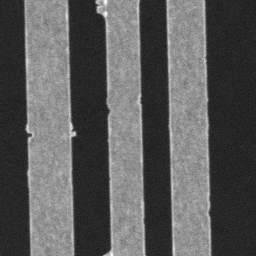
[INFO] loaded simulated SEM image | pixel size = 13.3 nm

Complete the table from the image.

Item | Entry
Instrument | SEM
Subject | one or a few lines or trenches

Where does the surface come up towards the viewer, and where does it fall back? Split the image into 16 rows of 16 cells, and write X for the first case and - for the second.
--XX--XXX-XXX---
--XX---XX-XXX---
--XX---XX--XX---
--XX---XX--XX---
--XX---XX--XX---
--XX---XX--XX---
--XX---XX--XX---
--XX---XX--XX---
--XX---XX--XX---
--XX---XX--XX---
---X---XX--XX---
--XX---XX--XX---
--XX---XX--XX---
--XXX---X--XX---
--XXX--XX--XX---
--XXX--XX--XX---